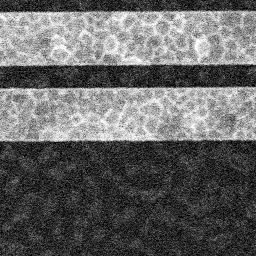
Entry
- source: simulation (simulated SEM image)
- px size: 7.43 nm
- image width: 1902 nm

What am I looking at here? one or a few lines or trenches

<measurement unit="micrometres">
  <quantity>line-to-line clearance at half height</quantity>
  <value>0.179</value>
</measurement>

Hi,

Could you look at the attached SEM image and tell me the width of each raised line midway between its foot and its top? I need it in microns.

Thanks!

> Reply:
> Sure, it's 0.383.